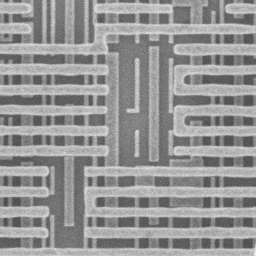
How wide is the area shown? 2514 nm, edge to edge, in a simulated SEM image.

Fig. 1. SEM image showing wiring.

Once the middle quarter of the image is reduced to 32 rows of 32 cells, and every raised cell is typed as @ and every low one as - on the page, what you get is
@@@@@@@@@@@-----------------@@@@
@@@@@@@@@@@-----------------@@@@
@@@@@-@@@@@-----------------@@@@
----------------------------@@--
----------------------------@@--
@@@@@-@@@@@-----------------@@@@
@@@@@@@@@@@----------------@@@@@
-------@@@@-----------------@@@@
--------------------------------
--------------------------------
---@@-----------------------@@@@
@@@@@@@@@@@-----------------@@@@
@@@@@@----------------------@@@@
----------------------------@@--
----------------------------@@--
@@@-------------------------@@@-
@@@@@@@@@@@-----------------@@@@
@@@@@@@@@@@-----------------@@@@
--------------------------------
--------------------------------
--------------------------------
@@@@@@@@@@@-----------------@@@@
@@@@@@@@@@@-----------------@@@@
--------------------------------
--------------------------------
--------------------------------
-----@@@@@@@@@@@@@@@@@@@@@@@@@@@
-----@@@@@@@@@@@@@@@@@@@@@@@@@@@
--------------------------------
--------------------------------
--------------------------------
-----@@@@@@@@@@@@@@@@@@@@@@@@@@@